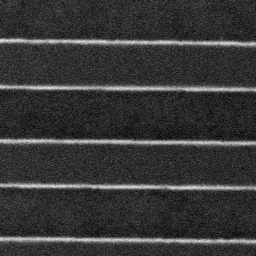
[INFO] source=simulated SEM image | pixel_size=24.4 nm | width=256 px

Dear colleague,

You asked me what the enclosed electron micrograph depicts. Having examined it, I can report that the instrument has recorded lines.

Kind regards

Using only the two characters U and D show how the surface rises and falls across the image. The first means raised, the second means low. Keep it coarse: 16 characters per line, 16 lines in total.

DDDDDDDDDDDDDDDD
DDDDDDDDDDDDDDDD
DDDDDDDDDDDDDDDD
UUUUUUUUUUUUUUUU
UUUUUUUUUUUUUUUU
DDDUUUUUUUUUUUUU
DDDDDDDDDDDDDDDD
DDDDDDDDDDDDDDDD
DDDDDDDDDDDDDDDD
UUUUUUUUUUUUUUUU
UUUUUUUUUUUUUUUU
UUUUUUUUUUUUUUUU
DDDDDDDDDDDDDDDD
DDDDDDDDDDDDDDDD
DDDDDDDDDDDDDDDD
UUUUUUUUUUUUUUUU